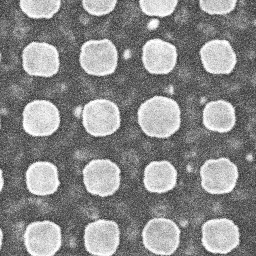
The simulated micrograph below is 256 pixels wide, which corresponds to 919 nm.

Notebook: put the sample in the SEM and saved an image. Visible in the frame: a regular array of raised bodies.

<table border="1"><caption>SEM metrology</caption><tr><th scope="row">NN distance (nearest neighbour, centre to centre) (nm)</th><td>210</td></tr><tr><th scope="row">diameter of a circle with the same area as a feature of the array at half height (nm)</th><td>129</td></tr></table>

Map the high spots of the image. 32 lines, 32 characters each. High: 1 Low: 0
00011110001111000011110001111000
00011110000110000011100000111000
00000000000000000000000000000000
00000000000000000000000000000000
00000000000000000000000000000000
00001100000111000011100000111000
00011110001111100011110001111000
00011110001111100011110001111000
00011110001111000011110000111000
00000100000000000000000000000000
00000000000000000000000000000000
00000000000000000000000000000000
00000000000000000001100000000000
00011110001111100011110000111000
00011110001111100111110000111000
00011110000111100111110000111000
00011100000111000011110000000000
00000000000000000000000000000000
00000000000000000000000000000000
00000000000000000000000000000000
00001100000111000001100000111000
00011110001111100011110001111100
00011110000111100011110001111100
00001110000111100011100000111000
00000000000000000000000000000000
00000000000000000000000000000000
00000000000000000000000000000000
00000000000000000001100000010000
00011110000111100011110001111000
00011111000111100011110001111100
00011111000111100011110001111100
00001110000111000001110000010000